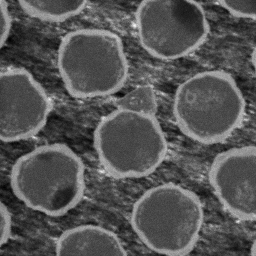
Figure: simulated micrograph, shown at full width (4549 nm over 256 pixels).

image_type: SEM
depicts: raised bodies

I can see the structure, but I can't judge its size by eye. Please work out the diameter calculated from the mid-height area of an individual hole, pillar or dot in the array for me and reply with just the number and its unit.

66.6 pixels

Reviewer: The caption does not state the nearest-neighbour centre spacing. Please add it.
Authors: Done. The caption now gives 1510 nanometers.